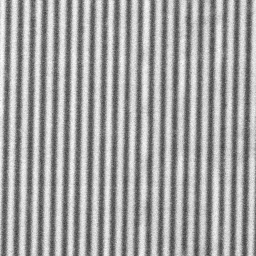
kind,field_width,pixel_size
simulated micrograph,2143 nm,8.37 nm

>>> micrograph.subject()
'parallel lines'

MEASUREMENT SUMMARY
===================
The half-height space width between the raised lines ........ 55.4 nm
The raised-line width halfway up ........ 0.0408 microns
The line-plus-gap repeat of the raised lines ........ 101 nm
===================